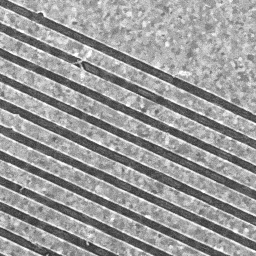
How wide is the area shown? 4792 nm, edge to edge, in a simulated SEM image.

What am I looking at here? parallel lines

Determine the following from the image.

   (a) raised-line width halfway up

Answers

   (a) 255 nm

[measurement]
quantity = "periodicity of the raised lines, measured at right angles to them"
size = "435 nanometers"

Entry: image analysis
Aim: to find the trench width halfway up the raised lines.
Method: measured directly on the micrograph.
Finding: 170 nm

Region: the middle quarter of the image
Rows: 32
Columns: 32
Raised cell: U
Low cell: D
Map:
UUDDDDDDUUUUUUUUDDDDDDUUUUUUUUUU
UUUUUDDDDDDUUUUUUUUDDDDDUUUUUUUU
UUUUUUUDDDDDDUUUUUUUUDDDDDUUUUUU
DUUUUUUUUDDDDDDUUUUUUUUDDDDDDUUU
DDDUUUUUUUUDDDDDDUUUUUUUUDDDDDDU
DDDDDUUUUUUUUDDDDDDUUUUUUUUDDDDD
UUDDDDDUUUUUUUUDDDDDDUUUUUUUUDDD
UUUUDDDDDDUUUUUUUUDDDDDDUUUUUUUU
UUUUUUDDDDDDUUUUUUUUDDDDDUUUUUUU
UUUUUUUUDDDDDDUUUUUUUUDDDDDUUUUU
DDUUUUUUUUUDDDDDUUUUUUUUDDDDDDUU
DDDDUUUUUUUUUDDDDDUUUUUUUUDDDDDD
UDDDDDUUUUUUUUUDDDDDUUUUUUUUDDDD
UUUDDDDDDUUUUUUUUDDDDDDUUUUUUUUD
UUUUUDDDDDDUUUUUUUUDDDDDDUUUUUUU
UUUUUUUDDDDDDUUUUUUUUDDDDDDUUUUU
DDUUUUUUUDDDDDDUUUUUUUUUDDDDDUUU
DDDDUUUUUUUUDDDDDUUUUUUUUUDDDDDU
DDDDDDUUUUUUUUDDDDDUUUUUUUUUDDDD
UUDDDDDDUUUUUUUUDDDDDDUUUUUUUUDD
UUUUDDDDDDUUUUUUUUDDDDDDUUUUUUUU
UUUUUUDDDDDDUUUUUUUUDDDDDDUUUUUU
DUUUUUUUDDDDDDDUUUUUUUUDDDDDDUUU
DDDUUUUUUUUDDDDDDUUUUUUUUDDDDDDU
DDDDDUUUUUUUUDDDDDDUUUUUUUUDDDDD
UDDDDDDUUUUUUUUDDDDDDUUUUUUUUDDD
UUUUDDDDDUUUUUUUUDDDDDDUUUUUUUUD
UUUUUUDDDDDUUUUUUUUDDDDDDUUUUUUU
UUUUUUUUDDDDDDUUUUUUUDDDDDDDUUUU
DDUUUUUUUUDDDDDDUUUUUUUUDDDDDDUU
DDDDUUUUUUUUDDDDDDUUUUUUUUDDDDDD
DDDDDDUUUUUUUUDDDDDDUUUUUUUUDDDD